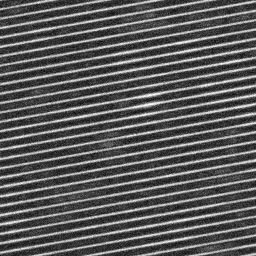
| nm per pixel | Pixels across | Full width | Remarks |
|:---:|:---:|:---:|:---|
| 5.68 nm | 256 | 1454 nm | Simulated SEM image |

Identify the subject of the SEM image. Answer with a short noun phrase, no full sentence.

parallel lines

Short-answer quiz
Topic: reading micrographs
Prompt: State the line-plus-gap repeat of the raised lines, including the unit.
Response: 52.4 nm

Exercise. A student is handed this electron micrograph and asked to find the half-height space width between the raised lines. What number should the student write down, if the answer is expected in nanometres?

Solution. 43.3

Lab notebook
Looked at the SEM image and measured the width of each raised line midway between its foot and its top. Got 1.36 pixels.